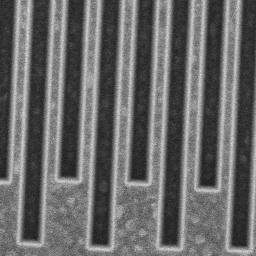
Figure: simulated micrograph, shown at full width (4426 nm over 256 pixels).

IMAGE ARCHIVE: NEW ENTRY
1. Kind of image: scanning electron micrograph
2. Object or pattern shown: parallel lines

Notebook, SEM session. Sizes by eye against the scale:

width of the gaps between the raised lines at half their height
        339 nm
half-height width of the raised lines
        259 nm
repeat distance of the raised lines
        602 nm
